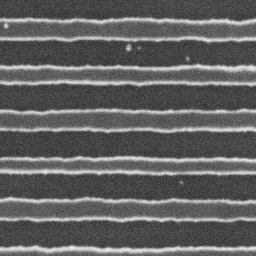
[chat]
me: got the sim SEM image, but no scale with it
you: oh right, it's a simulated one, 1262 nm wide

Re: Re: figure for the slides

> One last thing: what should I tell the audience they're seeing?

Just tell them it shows lines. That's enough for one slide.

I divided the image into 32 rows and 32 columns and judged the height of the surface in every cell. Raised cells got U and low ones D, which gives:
DDDDDDDDDDDDDDDDDDDDDDDDDDDDDDDD
DDDDDDDDDDDDDDDDDDDDDDDDDDDDDDDD
UUUUUUDDDUUDDUUUUUUUUUDDDDDDDDDU
UUUUUUUUUUUUUUUUUUUUUUUUUUUUUUUU
UUUUUUUUUUUUUUUUUUUUUUUUUUUUUUUU
DDDDDDDDDDDDDDDDDDDDDDDDDDDDDDDD
DDDDDDDDDDDDDDDDDDDDDDDDDDDDDDDD
DDDDDDDDDDDDDDDDDDDDDDDDDDDDDDDD
UUUUUUUUUUUUUUUUUUUUUUUUUUUUUUUU
UUUUUUUUUUUUUUUUUUUUUUUUUUUUUUUU
DUDUUDDDDDDDUDUDUUUDDDDUUUDUUUUU
DDDDDDDDDDDDDDDDDDDDDDDDDDDDDDDD
DDDDDDDDDDDDDDDDDDDDDDDDDDDDDDDD
DDDDDDDDDDDDDDDDDDDDDDDDDDDDDDDD
UUUUUUUUUUUUUUUUUUUUUUUUUUUUUUUU
UUUUUUUUUUUUUUUUUUUUUUUUUUUUUUUU
DDDDDDDDDDDDDDDDDDDDDDDDDDDDDDDD
DDDDDDDDDDDDDDDDDDDDDDDDDDDDDDDD
DDDDDDDDDDDDDDDDDDDDDDDDDDDDDDDD
DDDDDDDDDDDDDDDDDDDDDDDDDDDDDDDD
UUUUUUUUUUUUUUUUUUUUUUUUUUUUUUUU
UUUUUUDUUUUUUUUUUUUUUUUUUUUUUUUU
DDDDDDDDDDDDDDDDDDDDDDDDDDDDDDDD
DDDDDDDDDDDDDDDDDDDDDDDDDDDDDDDD
DDDDDDDDDDDDDDDDDDDDDDDDDDDDDDDD
UUUUUUUUUUUUUUUUUUUUUUUUUUUUUUUU
UUUUUUUUUUUUUUUUUUUUUUUUUUUUUUUU
UUUUUUUUUUUUDUUUUDUUUUUUUUUUUUUU
DDDDDDDDDDDDDDDDDDDDDDDDDDDDDDDD
DDDDDDDDDDDDDDDDDDDDDDDDDDDDDDDD
DDDDDDDDDDDDDDDDDDDDDDDDDDDDDDDD
UUUUUUUUUUUUUUUUUUUUUUUUUUUUUUUU